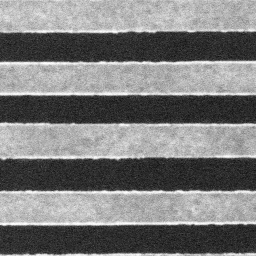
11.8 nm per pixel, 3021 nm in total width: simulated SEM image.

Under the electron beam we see lines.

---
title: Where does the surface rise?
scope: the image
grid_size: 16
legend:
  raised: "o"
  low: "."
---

oooooooooooooooo
oooooooooooooooo
................
................
oooooooooooooooo
oooooooooooooooo
................
................
oooooooooooooooo
oooooooooooooooo
................
................
oooooooooooooooo
oooooooooooooooo
................
................